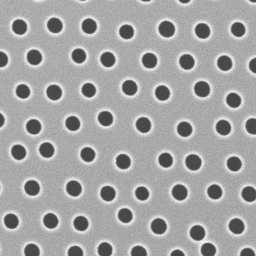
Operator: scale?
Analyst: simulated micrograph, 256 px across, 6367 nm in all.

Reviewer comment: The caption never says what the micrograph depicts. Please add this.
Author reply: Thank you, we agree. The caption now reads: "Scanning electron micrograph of a regular array of holes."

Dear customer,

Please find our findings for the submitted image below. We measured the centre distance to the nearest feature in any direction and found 827 nm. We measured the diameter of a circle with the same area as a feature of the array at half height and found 394 nm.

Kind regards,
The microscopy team